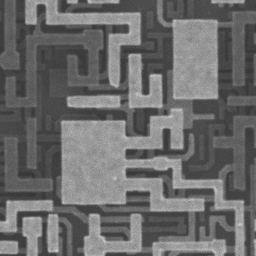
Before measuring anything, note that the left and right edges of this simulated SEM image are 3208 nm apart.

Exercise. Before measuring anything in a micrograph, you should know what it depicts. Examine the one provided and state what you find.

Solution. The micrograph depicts wiring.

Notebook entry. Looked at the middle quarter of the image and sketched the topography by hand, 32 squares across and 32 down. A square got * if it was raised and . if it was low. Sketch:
.**...***..***..***........*****
.**...***..***..***........*****
.**...***..***..***........*****
.********..***..***...**...*****
.********...**..***...**...*****
............**..***...**...*****
................***...**...*****
................***..***...*****
.*************..********....*.**
.*************..********........
.*************..********........
...........................***..
...........................***..
......................********..
***************.......********..
***************.......********..
***************.......**...***..
***************.......**...***..
************************...***..
************************...***..
************************...***..
***************.................
***************.................
***************........***......
*****************************...
*****************************...
***************............**...
***************............**...
****************...........**...
************************...*****
************************...*****
****************.....***........